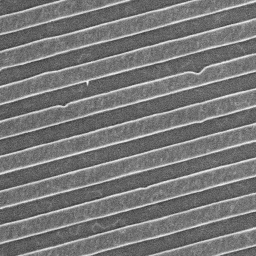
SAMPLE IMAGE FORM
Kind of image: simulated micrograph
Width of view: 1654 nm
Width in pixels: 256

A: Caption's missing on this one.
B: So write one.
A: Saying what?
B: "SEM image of parallel lines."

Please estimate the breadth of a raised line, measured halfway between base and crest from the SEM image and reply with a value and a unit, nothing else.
116 nanometers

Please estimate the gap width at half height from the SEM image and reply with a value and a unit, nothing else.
105 nm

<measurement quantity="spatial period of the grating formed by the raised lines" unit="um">0.217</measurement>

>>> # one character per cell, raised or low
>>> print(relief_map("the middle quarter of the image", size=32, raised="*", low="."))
...*****************............
****************................
************.................***
*********................*******
******...............***********
*................***************
.............*****************..
..........****************......
......****************..........
..*****************.............
***************................*
***********................*****
*******................*********
****................************
................****************
............******************..
........******************......
.....*****************..........
.*****************..............
***************...............**
***********...............******
*******...............**********
***................*************
................****************
............*****************...
........*****************.......
...******************...........
*****************...............
*************................***
**********...............*******
******...............***********
**...............***************